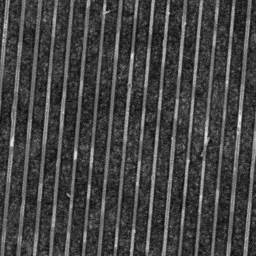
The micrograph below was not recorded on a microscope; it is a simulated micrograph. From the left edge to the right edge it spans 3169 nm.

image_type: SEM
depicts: parallel lines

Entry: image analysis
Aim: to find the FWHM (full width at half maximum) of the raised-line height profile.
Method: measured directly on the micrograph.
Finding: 32.4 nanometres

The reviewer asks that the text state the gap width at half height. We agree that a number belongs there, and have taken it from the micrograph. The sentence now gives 159 nm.